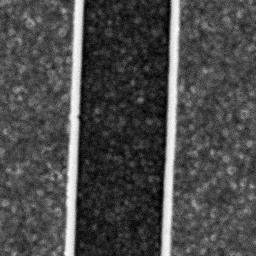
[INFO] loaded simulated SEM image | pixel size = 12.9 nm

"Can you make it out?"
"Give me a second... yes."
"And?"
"one or a few lines or trenches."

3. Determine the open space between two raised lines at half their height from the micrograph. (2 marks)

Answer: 1220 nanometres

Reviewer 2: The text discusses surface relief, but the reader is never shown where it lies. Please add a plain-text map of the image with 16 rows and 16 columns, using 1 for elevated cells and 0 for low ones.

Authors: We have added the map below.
1111100000011111
1111100000011111
1111100000011111
1111100000011111
1111100000011111
1111100000011111
1111100000011111
1111100000011111
1111100000011111
1111100000011111
1111100000011111
1111100000111111
1111100000111111
1111000000111111
1111000000111111
1111000000111111